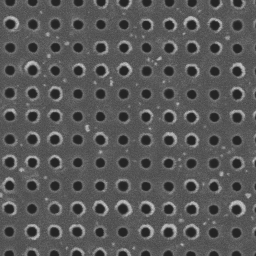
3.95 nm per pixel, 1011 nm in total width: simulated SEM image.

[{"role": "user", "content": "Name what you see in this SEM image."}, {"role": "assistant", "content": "a regular array of holes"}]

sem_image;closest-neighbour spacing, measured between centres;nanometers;88.1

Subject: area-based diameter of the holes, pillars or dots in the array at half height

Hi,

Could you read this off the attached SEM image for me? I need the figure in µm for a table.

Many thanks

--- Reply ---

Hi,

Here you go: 0.0359